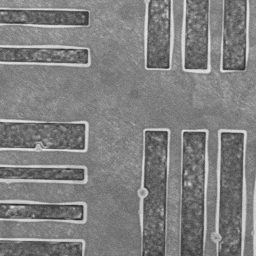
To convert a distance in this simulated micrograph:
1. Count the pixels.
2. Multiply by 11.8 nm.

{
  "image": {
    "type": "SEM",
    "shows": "groups of lines, slits or small figures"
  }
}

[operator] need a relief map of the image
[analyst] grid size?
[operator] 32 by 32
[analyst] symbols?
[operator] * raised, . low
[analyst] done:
******************...**...**...*
...........*******...**...**...*
...........*******...**...**...*
******************...**...**...*
******************...**...**...*
******************...**...**...*
...........*******...**...**...*
...........*******...**...**...*
*******************..**...**...*
********************************
********************************
********************************
********************************
********************************
********************************
...........*********************
...........*******...**...**..**
...........*******...**...*....*
....*......*******...**...*....*
******************...**...*....*
******************...**...*....*
...........*******...**...*....*
...........*******...**...*....*
******************...**...*....*
******************...**...*....*
..........********...**...*....*
...........*******...**...*....*
..........********...**...*....*
******************...**...*...**
******************...**...*...**
..........********...**..**...**
..........********...*...**...**